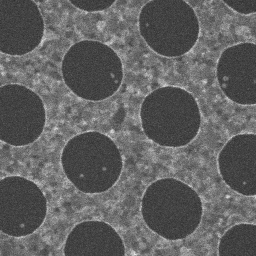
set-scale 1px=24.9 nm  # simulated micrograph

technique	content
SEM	holes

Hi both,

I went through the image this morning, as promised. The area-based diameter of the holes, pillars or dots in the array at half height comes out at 1.54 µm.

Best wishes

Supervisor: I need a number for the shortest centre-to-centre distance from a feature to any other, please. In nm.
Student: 2260